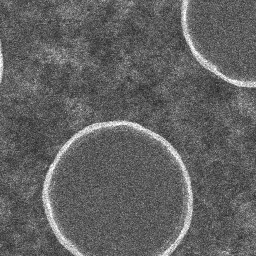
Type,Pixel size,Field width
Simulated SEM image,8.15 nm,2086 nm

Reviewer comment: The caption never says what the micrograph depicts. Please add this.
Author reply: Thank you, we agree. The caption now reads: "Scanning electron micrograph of raised bodies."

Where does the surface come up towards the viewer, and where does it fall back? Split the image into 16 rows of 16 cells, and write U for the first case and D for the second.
DDDDDDDDDDDDUUUU
DDDDDDDDDDDDUUUU
DDDDDDDDDDDDUUUU
DDDDDDDDDDDDUUUU
DDDDDDDDDDDDDDUU
DDDDDDDDDDDDDDDD
DDDDDDDDDDDDDDDD
DDDDDDDDDDDDDDDD
DDDDDUUUUUDDDDDD
DDDDUUUUUUUDDDDD
DDDUUUUUUUUDDDDD
DDDUUUUUUUUUDDDD
DDDUUUUUUUUUDDDD
DDDUUUUUUUUUDDDD
DDDDUUUUUUUDDDDD
DDDDUUUUUUUDDDDD